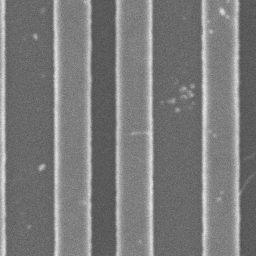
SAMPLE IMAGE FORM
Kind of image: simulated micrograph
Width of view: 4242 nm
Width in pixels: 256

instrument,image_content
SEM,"lines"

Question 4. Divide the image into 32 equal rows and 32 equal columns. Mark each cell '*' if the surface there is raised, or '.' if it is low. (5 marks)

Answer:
.......****....****......*****..
.......****....****......*****..
.......****....****......*****..
*......****....****......*****..
*......****....****......*****..
*......****....****......*****..
*......****....****......*****..
*......****....****......*****..
*......****....****......*****..
*......****....****......*****..
*......****....****......*****..
*......****....****......*****..
*......****....****......*****..
*......****....****......*****..
.......****....****......*****..
*......****....****......*****..
*......****....****......*****..
*......****....****......*****..
*......****....****......*****..
*......****....****......*****..
*......****....****......*****..
*......****....****......*****..
*......****....****......*****..
*......****....****......*****..
*......****....****......*****..
*......****....****......*****..
*......****....****......*****..
*......****....****......*****..
*......****....****......*****..
*......****....****......*****..
*......****....****......*****..
*......****....****......*****..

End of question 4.